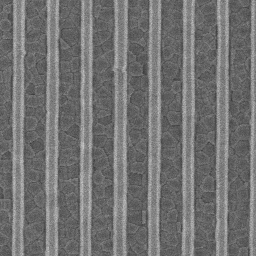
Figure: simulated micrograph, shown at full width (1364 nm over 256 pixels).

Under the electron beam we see parallel lines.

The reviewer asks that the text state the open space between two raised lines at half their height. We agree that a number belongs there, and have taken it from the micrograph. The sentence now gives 136 nanometers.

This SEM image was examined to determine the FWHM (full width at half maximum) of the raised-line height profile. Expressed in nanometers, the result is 45.3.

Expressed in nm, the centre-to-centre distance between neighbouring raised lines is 181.